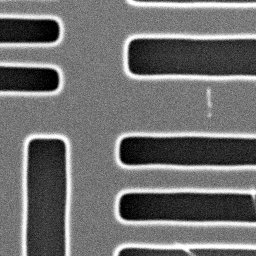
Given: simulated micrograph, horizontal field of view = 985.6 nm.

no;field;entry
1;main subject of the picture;groups of lines, slits or small figures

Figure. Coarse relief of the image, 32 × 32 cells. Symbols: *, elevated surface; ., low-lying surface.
*********************...........
********************************
.......*************************
........************************
.......*************************
......**********................
****************................
****************................
.......*********................
.......***********..****........
.......*************************
......**************************
********************************
********************************
********************************
********************************
********************************
****....*******.................
***.....*******.................
***.....*******.................
***.....*******.................
***.....************************
***......***********************
***......***********************
***.....*******.................
***.....*******.................
***.....*******.................
***.....*******.................
***.....************************
***.....************************
***.....************************
***.....*******.................